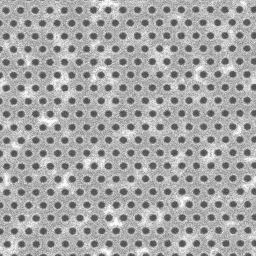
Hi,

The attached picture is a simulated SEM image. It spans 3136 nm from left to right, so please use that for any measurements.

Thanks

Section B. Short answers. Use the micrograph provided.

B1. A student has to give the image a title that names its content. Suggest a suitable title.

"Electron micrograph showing a regular array of holes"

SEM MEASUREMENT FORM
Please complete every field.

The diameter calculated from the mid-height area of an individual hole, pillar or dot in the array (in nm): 90.7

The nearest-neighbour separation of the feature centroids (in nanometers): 177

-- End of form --